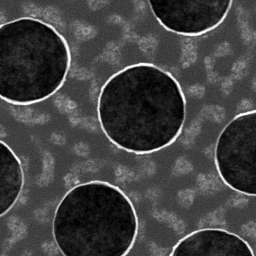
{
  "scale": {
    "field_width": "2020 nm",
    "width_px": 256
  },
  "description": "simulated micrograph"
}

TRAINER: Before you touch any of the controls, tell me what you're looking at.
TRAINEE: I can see holes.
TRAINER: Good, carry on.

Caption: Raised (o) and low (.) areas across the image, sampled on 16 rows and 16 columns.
oooooooooo....oo
o..ooooooo...ooo
....oooooooooooo
....oooooooooooo
....oooo..oooooo
...oooo....ooooo
oooooo.....ooooo
oooooo.....oooo.
ooooooo....ooo..
.ooooooooooooo..
.ooooooooooooo..
.ooooooooooooo..
.ooo....oooooooo
ooo.....oooooooo
ooo.....oooo..oo
oooo....ooo.....